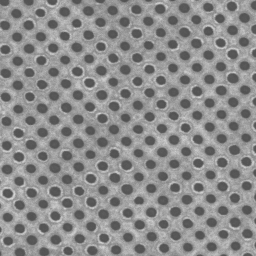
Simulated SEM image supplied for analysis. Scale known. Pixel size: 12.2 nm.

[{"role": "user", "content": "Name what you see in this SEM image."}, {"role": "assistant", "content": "a regular array of holes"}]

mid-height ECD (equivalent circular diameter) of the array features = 122 nm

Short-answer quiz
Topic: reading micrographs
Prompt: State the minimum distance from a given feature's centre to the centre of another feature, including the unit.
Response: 203 nanometers